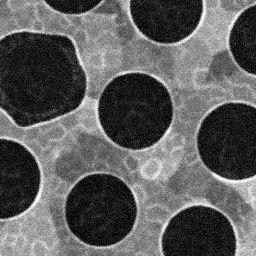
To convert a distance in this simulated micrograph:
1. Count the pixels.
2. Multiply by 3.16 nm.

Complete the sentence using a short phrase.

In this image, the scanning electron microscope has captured holes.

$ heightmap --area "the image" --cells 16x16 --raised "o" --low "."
ooo...oo.....oo.
oooooooo....ooo.
....ooooo..ooo..
.....oooooooooo.
.....oooooooooo.
.....oo...oooooo
.....o.....ooo..
o..ooo.....oo...
ooooooo...oo....
..oooooooooo....
..ooooooooooo...
...oo...oooooooo
..oo....oooooooo
.ooo.....oo...oo
oooo....oo.....o
oooooooooo.....o